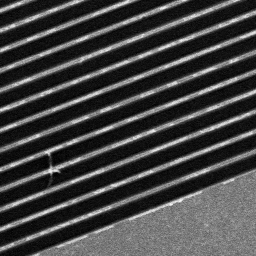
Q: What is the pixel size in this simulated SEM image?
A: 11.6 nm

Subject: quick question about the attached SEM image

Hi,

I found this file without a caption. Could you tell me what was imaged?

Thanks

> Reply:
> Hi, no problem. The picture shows parallel lines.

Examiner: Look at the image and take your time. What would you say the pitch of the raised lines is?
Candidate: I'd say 216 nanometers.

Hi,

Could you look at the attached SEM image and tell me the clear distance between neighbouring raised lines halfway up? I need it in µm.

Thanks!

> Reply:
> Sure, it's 0.164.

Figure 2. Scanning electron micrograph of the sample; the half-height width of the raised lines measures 0.0556 micrometres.